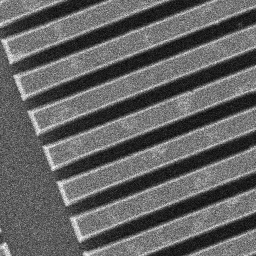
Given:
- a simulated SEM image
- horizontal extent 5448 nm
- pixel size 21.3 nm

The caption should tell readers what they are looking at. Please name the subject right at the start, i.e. parallel lines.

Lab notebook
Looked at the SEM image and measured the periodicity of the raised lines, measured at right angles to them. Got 804 nanometres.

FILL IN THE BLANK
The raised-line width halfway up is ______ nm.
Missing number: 506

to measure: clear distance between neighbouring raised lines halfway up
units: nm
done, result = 292